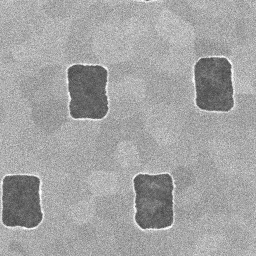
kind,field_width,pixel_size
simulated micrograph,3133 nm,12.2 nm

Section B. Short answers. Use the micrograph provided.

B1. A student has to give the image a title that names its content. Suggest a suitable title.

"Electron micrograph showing holes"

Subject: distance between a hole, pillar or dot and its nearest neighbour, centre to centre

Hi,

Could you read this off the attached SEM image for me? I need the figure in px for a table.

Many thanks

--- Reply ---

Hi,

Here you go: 127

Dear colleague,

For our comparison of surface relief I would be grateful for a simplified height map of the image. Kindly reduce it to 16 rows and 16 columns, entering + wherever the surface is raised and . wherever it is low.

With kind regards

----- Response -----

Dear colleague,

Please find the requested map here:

++++++++++++++++
++++++++++++++++
++++++++++++++++
++++++++++++++++
++++...+++++..++
++++...+++++...+
++++...+++++...+
++++++++++++++++
++++++++++++++++
++++++++++++++++
++++++++++++++++
..++++++...+++++
...+++++...+++++
...+++++...+++++
++++++++++++++++
++++++++++++++++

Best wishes